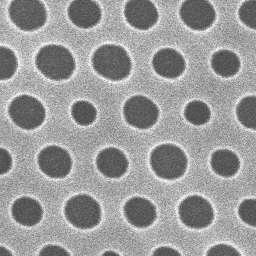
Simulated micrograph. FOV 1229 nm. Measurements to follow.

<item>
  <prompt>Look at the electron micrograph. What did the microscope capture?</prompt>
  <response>a regular array of holes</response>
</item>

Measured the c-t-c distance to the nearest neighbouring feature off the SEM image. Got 270 nanometres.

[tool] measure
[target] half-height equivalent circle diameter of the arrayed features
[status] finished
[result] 32 px